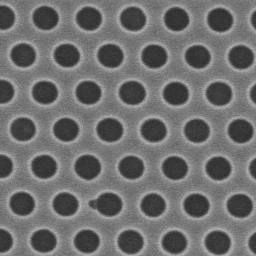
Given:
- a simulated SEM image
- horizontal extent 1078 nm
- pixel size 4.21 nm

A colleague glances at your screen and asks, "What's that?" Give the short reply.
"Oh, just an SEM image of a regular array of holes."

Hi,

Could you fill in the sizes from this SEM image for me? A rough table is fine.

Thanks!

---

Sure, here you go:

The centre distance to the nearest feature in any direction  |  181 nanometres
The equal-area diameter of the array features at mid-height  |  110 nm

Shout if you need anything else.